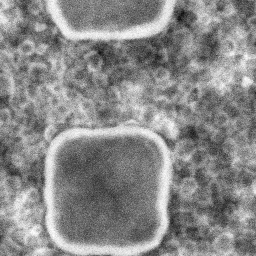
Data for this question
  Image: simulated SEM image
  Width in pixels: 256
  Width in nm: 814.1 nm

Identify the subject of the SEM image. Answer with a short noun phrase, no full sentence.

raised bodies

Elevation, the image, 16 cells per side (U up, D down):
DDDUUUUUUUUDDDDD
DDDDUUUUUUDDDDDD
DDDDDDDDDDDDDDDD
DDDDDDDDDDDDDDDD
DDDDDDDDDDDDDDDD
DDDDDDDDDDDDDDDD
DDDDDDDDDDDDDDDD
DDDDDDDDDDDDDDDD
DDDDUUUUUUDDDDDD
DDDUUUUUUUDDDDDD
DDDUUUUUUUUDDDDD
DDDUUUUUUUDDDDDD
DDDUUUUUUUDDDDDD
DDDUUUUUUUDDDDDD
DDDUUUUUUUDDDDDD
DDDDUUUUUDDDDDDD